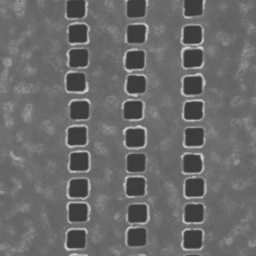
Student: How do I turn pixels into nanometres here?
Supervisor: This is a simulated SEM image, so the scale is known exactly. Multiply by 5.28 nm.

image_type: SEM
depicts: a regular array of holes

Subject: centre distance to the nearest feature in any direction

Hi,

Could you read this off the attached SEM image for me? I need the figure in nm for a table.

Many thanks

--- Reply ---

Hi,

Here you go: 129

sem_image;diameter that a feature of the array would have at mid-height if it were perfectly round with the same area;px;19.8